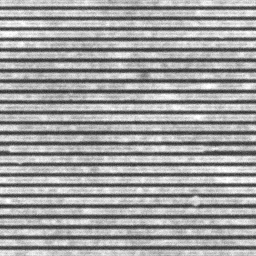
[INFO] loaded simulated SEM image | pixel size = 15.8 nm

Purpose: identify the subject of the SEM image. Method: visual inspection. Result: parallel lines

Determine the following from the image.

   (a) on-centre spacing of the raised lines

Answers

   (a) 164 nanometres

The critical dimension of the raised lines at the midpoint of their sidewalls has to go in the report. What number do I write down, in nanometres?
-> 75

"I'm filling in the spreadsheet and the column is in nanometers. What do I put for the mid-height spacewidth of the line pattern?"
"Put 88.8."